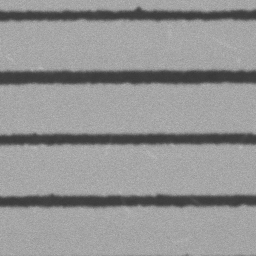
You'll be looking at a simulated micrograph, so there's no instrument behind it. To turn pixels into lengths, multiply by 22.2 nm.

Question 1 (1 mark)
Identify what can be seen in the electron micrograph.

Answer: one or a few lines or trenches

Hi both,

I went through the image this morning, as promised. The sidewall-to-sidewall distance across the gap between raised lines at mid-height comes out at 1.08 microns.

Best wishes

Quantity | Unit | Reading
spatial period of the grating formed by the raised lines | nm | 1370